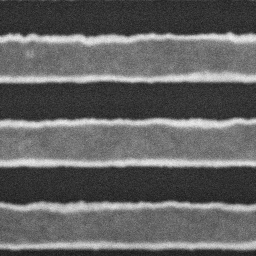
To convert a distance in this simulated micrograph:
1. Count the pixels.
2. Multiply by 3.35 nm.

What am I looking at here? lines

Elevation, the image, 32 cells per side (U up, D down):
DDDDDDDDDDDDDDDDDDDDDDDDDDDDDDDD
DDDDDDDDDDDDDDDDDDDDDDDDDDDDDDDD
DDDDDDDDDDDDDDDDDDDDDDDDDDDDDDDD
DDDDDDDDDDDDDDDDDDDDDDDDDDDDDDDD
DUUUUDDDDUDDDUUDDUUUUUUUUUUUUUUU
UUUUUUUUUUUUUUUUUUUUUUUUUUUUUUUU
UUUUUUUUUUUUUUUUUUUUUUUUUUUUUUUU
UUUUUUUUUUUUUUUUUUUUUUUUUUUUUUUU
UUUUUUUUUUUUUUUUUUUUUUUUUUUUUUUU
UUUUUUUUUUUUUUUUUUUUUUUUUUUUUUUU
DDDDDDDDDDDDDDDDDDDDDDDDDDDDDDDD
DDDDDDDDDDDDDDDDDDDDDDDDDDDDDDDD
DDDDDDDDDDDDDDDDDDDDDDDDDDDDDDDD
DDDDDDDDDDDDDDDDDDDDDDDDDDDDDDDD
DDDDDDDDDDDDDDDDDDDDDDDDDDDDDDDD
UUUUUUUUUUUUUUUUUUUUUUUUUUUUUUUU
UUUUUUUUUUUUUUUUUUUUUUUUUUUUUUUU
UUUUUUUUUUUUUUUUUUUUUUUUUUUUUUUU
UUUUUUUUUUUUUUUUUUUUUUUUUUUUUUUU
UUUUUUUUUUUUUUUUUUUUUUUUUUUUUUUU
UUUUUUUUUUUUUUUUUUUUUUUUUUUUUUUU
DDDDDDDDDDDDDDDDDDDDDDDDDDDDDDDD
DDDDDDDDDDDDDDDDDDDDDDDDDDDDDDDD
DDDDDDDDDDDDDDDDDDDDDDDDDDDDDDDD
DDDDDDDDDDDDDDDDDDDDDDDDDDDDDDDD
UDDDUUUDDUUUUUUUUUUUUUUUUDUUDDDD
UUUUUUUUUUUUUUUUUUUUUUUUUUUUUUUU
UUUUUUUUUUUUUUUUUUUUUUUUUUUUUUUU
UUUUUUUUUUUUUUUUUUUUUUUUUUUUUUUU
UUUUUUUUUUUUUUUUUUUUUUUUUUUUUUUU
UUUUUUUUUUUUUUUUUUUUUUUUUUUUUUUU
DDDDDDDDDDDDDDDDDDDDDDDDDDDDDDDD